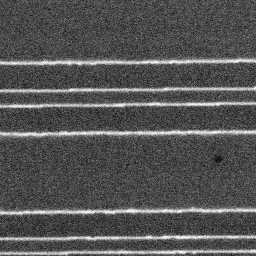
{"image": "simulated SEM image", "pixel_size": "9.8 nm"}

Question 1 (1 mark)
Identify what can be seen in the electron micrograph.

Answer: lines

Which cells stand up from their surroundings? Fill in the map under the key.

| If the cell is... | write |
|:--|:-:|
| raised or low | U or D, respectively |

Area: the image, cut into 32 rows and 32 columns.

UUUUUUUUUUUUUUUUUUUUUUUUUUUUUUUU
UUUUUUUUUUUUUUUUUUUUUUUUUUUUUUUU
UUUUUUUUUUUUUUUUUUUUUUUUUUUUUUUU
UUUUUUUUUUUUUUUUUUUUUUUUUUUUUUUU
UUUUUUUUUUUUUUUUUUUUUUUUUUUUUUUU
UUUUUUUUUUUUUUUUUUUUUUUUUUUUUUUU
UUUUUUUUUUUUUUUUUUUUUUUUUUUUUUUU
UUUUUUUUUUUUUUUUUUUUUUUUUUUUUUUU
DDDDDDDDDDDDDDDDDDDDDDDDDDDDDDDD
DDDDDDDDDDDDDDDDDDDDDDDDDDDDDDDD
DDDDDDDDDDDDDDDDDDDDDDDDDDDDDDDD
UUUUUUUUUUUUUUUUUUUUUUUUUUUUUUUU
UUUUUUUUUUUUUUUUUUUUUUUUUUUUUUUU
DDDDDDDDDDDDDDDDDDDDDDDDDDDDDDDD
DDDDDDDDDDDDDDDDDDDDDDDDDDDDDDDD
DDDDDDDDDDDDDDDDDDDDDDDDDDDDDDDD
DDDDDDDDDDDDDDDDDDDDDDDDDDDUUUUU
UUUUUUUUUUUUUUUUUUUUUUUUUUUUUUUU
UUUUUUUUUUUUUUUUUUUUUUUUUUUUUUUU
UUUUUUUUUUUUUUUUUUUUUUUUUUUUUUUU
UUUUUUUUUUUUUUUUUUUUUUUUUUUUUUUU
UUUUUUUUUUUUUUUUUUUUUUUUUUUUUUUU
UUUUUUUUUUUUUUUUUUUUUUUUUUUUUUUU
UUUUUUUUUUUUUUUUUUUUUUUUUUUUUUUU
UUUUUUUUUUUUUUUUUUUUUUUUUUUUUUUU
UUUUUUUUUUUUUUUUUUUUUUUUUUUUUUUU
UUUUUUUUUUUUDDDDDDDDDDDDDDDDDDDD
DDDDDDDDDDDDDDDDDDDDDDDDDDDDDDDD
DDDDDDDDDDDDDDDDDDDDDDDDDDDDDDDD
DDDDDDDDDDDDDDDDDDDDDDDDDDDDDDDD
UUUUUUUUUUUUUUUUUUUUUUUUUUUUUUUU
UUUUUUUUUUUUUUUUUUUUUUUDDDDDDDDD